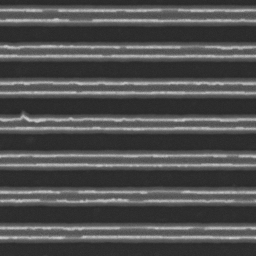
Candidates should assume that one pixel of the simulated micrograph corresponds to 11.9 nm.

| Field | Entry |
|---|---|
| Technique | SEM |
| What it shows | parallel lines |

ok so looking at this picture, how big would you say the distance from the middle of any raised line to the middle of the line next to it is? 430 nm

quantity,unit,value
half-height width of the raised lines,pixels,14.4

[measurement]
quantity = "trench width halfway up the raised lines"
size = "262 nm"